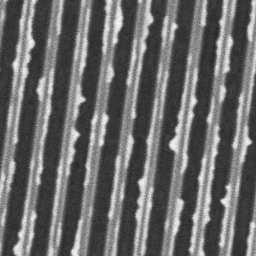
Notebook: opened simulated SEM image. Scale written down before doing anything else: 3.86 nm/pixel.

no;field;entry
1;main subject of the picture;parallel lines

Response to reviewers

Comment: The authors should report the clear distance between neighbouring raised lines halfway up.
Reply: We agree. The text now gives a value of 58.8 nanometers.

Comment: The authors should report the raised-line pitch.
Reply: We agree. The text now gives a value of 110 nm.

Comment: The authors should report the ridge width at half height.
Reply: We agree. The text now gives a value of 12.5 pixels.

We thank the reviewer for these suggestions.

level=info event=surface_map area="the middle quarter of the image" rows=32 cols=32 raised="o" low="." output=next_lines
..ooo....ooo....ooo.....oo.....o
..ooo....ooo....ooo....ooo.....o
..ooo....ooo....ooo....ooo....oo
..ooo....ooo....ooo....ooo....oo
..oo....oooo....ooo....ooo....oo
.ooo....oooo....ooo....ooo....oo
.ooo....ooo....oooo....ooo....oo
.ooo....ooo....oooo....ooo....oo
.oooo...ooo....ooo....ooo.....oo
.oooo...ooo....ooo....ooo.....oo
.ooo....ooo....ooo....ooo....ooo
.ooo....ooo....ooo....ooo....ooo
oooo...oooo....ooo....ooo....ooo
ooo....oooo....ooo....ooo....ooo
ooo....oooo...ooo.....ooo....ooo
ooo....ooo....ooo....ooo....oooo
ooo....ooo....ooo....ooo....oooo
oooo...ooo....ooo....ooo....ooo.
ooo....ooo....ooo....ooo...oooo.
ooo....ooo....ooo....ooo...oooo.
oo....oooo....ooo....ooo..ooooo.
ooo...ooo....oooo....ooo...oooo.
ooo...ooo....oooo....oo.....ooo.
oo....ooo....ooo....ooo.....ooo.
oo....ooo....ooo....ooo....oooo.
oo...oooo....ooo....ooo....oooo.
oo....oo.....ooo....ooo....ooo..
o.....oo.....ooo....ooo....ooo..
o....ooo....oooo...oooo....ooo..
o....ooo....oooo...oooo....ooo..
o....ooo....ooo....ooo.....ooo..
o....ooo....ooo....ooo.....ooo..